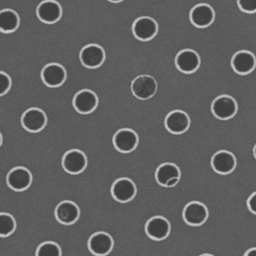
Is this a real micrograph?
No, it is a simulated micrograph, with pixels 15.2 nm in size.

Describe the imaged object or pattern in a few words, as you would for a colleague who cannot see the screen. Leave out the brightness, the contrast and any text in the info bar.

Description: a regular array of raised bodies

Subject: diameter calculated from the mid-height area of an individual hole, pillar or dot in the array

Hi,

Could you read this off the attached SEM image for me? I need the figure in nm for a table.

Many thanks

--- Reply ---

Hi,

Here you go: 364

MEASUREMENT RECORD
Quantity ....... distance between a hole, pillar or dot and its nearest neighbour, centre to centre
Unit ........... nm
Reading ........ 737